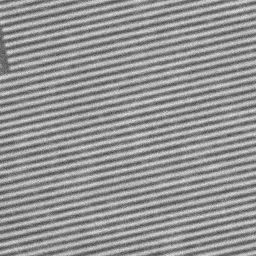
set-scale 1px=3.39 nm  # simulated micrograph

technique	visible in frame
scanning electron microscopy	parallel lines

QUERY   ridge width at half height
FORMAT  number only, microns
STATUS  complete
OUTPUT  0.0095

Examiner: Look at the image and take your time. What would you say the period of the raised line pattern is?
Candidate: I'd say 26.3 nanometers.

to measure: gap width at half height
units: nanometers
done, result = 15.8